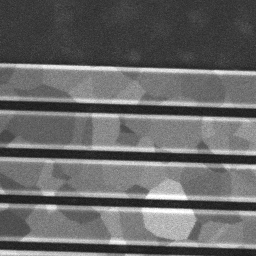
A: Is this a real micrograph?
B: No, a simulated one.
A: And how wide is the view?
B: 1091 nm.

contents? parallel lines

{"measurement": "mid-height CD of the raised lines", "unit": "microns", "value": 0.143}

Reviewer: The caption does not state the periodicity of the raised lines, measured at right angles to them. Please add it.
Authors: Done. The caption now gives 199 nanometres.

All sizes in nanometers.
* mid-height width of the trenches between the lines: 54.3